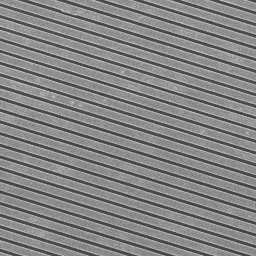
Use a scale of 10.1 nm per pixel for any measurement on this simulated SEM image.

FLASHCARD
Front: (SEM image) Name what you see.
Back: parallel lines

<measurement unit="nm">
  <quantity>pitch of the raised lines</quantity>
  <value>112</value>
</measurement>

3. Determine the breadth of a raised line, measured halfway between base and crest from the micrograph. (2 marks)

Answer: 84.2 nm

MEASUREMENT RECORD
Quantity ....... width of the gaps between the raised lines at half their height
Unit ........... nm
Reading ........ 28.9